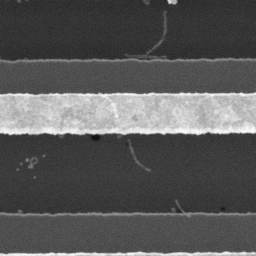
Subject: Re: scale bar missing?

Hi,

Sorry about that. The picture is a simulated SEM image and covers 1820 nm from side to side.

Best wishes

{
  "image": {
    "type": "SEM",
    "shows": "lines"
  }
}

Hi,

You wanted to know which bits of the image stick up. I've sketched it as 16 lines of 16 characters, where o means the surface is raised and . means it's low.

................
................
................
................
oooooooooooooooo
oooooooooooooooo
oooooooooooooooo
oooooooooooooooo
................
................
................
................
................
oooooooooooooooo
oooooooooooooooo
oooooooooooooooo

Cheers